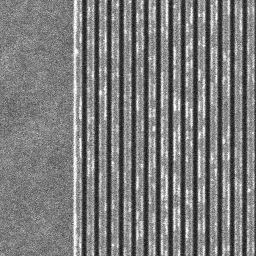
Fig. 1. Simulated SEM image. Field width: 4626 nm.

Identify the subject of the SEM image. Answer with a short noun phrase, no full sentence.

parallel lines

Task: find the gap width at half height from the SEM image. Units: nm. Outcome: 104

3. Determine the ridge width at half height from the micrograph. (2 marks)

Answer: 0.122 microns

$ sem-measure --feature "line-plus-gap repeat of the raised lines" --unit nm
223